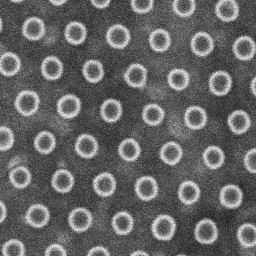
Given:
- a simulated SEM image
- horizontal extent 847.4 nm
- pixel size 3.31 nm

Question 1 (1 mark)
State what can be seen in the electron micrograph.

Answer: a regular array of raised bodies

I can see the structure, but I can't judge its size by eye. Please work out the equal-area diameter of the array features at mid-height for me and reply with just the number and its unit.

68.5 nm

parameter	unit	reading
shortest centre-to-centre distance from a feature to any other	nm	139